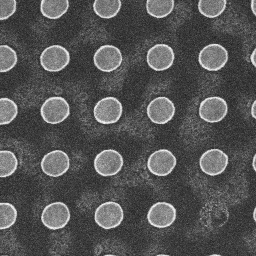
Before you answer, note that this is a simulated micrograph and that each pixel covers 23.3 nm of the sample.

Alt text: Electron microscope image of a regular array of raised bodies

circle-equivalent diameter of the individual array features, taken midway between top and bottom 620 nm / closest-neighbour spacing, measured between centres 52.3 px